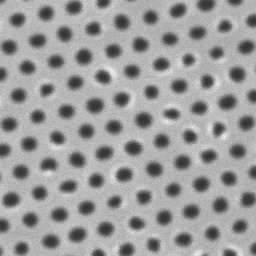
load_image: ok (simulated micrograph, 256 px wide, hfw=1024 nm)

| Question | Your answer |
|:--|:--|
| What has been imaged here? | a regular array of holes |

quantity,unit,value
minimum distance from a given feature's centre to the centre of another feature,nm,112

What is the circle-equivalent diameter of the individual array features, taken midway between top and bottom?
15.8 px